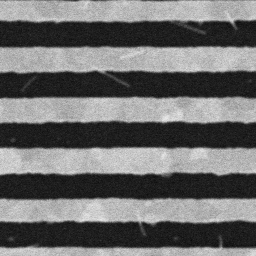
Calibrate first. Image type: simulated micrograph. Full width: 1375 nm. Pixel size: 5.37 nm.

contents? lines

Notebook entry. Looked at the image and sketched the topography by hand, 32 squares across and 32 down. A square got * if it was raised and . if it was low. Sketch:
********************************
********************************
**.******************...******..
................................
................................
................................
********************************
********************************
********************************
................................
................................
................................
********************************
********************************
********************************
................................
................................
................................
................................
********************************
********************************
********************************
................................
................................
................................
********************************
********************************
********************************
................................
................................
................................
********************************